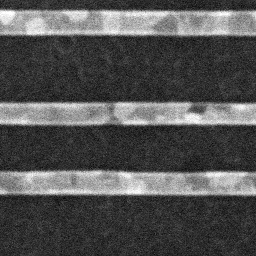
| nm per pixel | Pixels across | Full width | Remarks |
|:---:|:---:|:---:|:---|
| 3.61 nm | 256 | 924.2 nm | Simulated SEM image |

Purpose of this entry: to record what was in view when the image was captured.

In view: one or a few lines or trenches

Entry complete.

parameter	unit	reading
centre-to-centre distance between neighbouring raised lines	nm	289